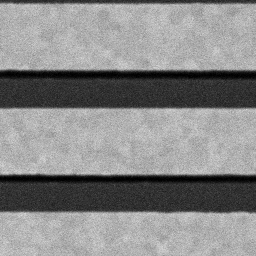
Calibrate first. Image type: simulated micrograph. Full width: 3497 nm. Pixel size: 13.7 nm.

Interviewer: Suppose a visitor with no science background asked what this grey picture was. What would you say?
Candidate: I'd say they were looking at lines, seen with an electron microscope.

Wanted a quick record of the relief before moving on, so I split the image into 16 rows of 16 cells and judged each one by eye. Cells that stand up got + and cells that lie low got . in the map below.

++++++++++++++++
++++++++++++++++
++++++++++++++++
++++++++++++++++
................
................
................
++++++++++++++++
++++++++++++++++
++++++++++++++++
++++++++++++++++
................
................
++++++++++++++++
++++++++++++++++
++++++++++++++++